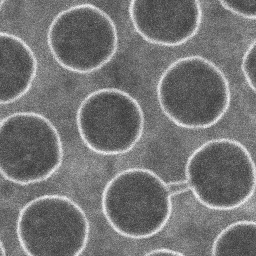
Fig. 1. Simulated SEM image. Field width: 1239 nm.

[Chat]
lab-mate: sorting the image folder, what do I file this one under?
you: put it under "raised bodies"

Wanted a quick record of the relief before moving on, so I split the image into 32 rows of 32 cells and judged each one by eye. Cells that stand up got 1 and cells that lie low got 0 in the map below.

00000000000000001111111110001111
00000000111110001111111110000111
00000001111111000111111110000000
00000011111111000111111110000000
11000011111111100011111100000000
11100011111111100000110000000000
11110001111111000000000000000001
11110001111111000000001111000011
11110000011100000000011111100011
11110000000000000000111111110001
11110000000000000000111111110001
11100000000011100000111111111000
11000000000111111000111111111000
00000000001111111000111111110000
01111000001111111100011111110000
11111100001111111100001111100000
11111110001111111100000000000000
11111110001111111000000000010000
11111111000111110000000001111100
11111111000000000000000011111110
11111110000000000000000011111111
11111110000000011110000111111111
01111000000000111111000111111111
00000000000001111111111111111111
00000000000001111111110001111110
00001111100001111111100001111100
00011111110001111111100000000000
00111111111000111111100000000000
00111111111000111111000000001111
00111111111000001100000000011111
00011111111000000000000000011111
00011111110000000001110000011111